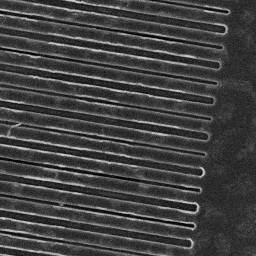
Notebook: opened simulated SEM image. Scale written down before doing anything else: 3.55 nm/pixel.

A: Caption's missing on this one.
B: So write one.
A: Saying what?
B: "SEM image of parallel lines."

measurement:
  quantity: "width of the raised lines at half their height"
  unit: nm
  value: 46.9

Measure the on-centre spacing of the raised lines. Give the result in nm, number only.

64.3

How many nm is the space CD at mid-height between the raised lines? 22.4